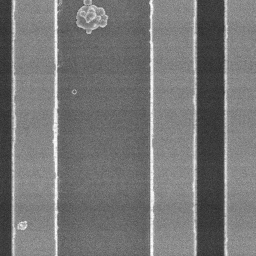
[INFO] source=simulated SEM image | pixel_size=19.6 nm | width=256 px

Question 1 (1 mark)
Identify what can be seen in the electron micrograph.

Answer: lines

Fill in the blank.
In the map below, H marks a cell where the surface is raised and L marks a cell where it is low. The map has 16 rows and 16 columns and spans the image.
LHHLLLLLLHHHLLHH
LHHHLLLLLHHHLLHH
LHHHLLLLLHHHLLHH
LHHHLLLLLHHHLLHH
LHHHLLLLLHHHLLHH
LHHHLLLLLHHHLLHH
LHHHLLLLLHHHLLHH
LHHLLLLLLHHHLLHH
LHHLLLLLLHHHLLHH
LHHLLLLLLHHHLLHH
LHHHLLLLLLHHLLHH
LHHHLLLLLLHHLLHH
LHHLLLLLLLHHLLHH
LHHLLLLLLLHHLLHH
LHHHLLLLLLHHLLHH
LHHHLLLLLLHHLLHH